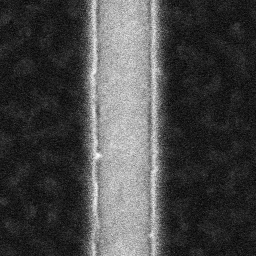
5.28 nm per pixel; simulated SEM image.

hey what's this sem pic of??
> one or a few lines or trenches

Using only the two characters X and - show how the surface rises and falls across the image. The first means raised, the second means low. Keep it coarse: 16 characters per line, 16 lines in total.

XXXXXX---XXXXXXX
XXXXXX----XXXXXX
XXXXXX----XXXXXX
XXXXXX---XXXXXXX
XXXXXX----XXXXXX
XXXXXX----XXXXXX
XXXXXX----XXXXXX
XXXXXX----XXXXXX
XXXXXX----XXXXXX
XXXXXX----XXXXXX
XXXXXX----XXXXXX
XXXXXX----XXXXXX
XXXXXX----XXXXXX
XXXXXX----XXXXXX
XXXXXX---XXXXXXX
XXXXXX----XXXXXX